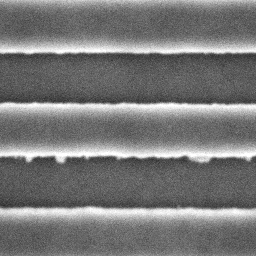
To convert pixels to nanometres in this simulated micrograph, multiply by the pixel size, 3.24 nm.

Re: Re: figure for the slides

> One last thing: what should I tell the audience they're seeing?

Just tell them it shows lines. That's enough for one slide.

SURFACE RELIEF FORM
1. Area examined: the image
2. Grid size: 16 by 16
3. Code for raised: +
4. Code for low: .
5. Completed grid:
++++++++++++++++
++++++++++++++++
++++++++++++++++
................
................
................
+.+.............
++++++++++++++++
++++++++++++++++
++++++++++++++++
................
................
................
++++++++++++++++
++++++++++++++++
++++++++++++++++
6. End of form